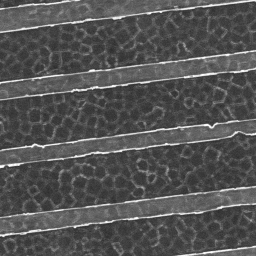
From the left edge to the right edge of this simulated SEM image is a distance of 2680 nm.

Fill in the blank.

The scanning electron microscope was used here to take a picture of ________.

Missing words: one or a few lines or trenches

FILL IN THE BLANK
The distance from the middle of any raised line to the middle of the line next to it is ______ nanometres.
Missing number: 697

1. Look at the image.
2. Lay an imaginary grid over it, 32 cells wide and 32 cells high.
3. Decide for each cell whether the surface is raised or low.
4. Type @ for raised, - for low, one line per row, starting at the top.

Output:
@@@@@@@---------------------@@@@
-------------------@@@@@@@@@@@@@
-----------@@@@@@@@@@@@@@@@@@@@@
----@@@@@@@@@@@@@@@@@@@@@@@@@@@@
@@@@@@@@@@@@@@@@@@@@@@@@@@@@@@@@
@@@@@@@@@@@@@@@@@@@@@@@@@@@@@@@@
@@@@@@@@@@@@@@@@@@@@@@@@@@@@@@@-
@@@@@@@@@@@@@@@@@@@@@@@---------
@@@@@@@@@@@@@@@-----------------
@@@@@@@-----------------@@@@@@@@
----------------@@@@@@@@@@@@@@@@
--------@@@@@@@@@@@@@@@@@@@@@@@@
@@@@@@@@@@@@@@@@@@@@@@@@@@@@@@@@
@@@@@@@@@@@@@@@@@@@@@@@@@@@@@@@@
@@@@@@@@@@@@@@@@@@@@@@@@@@@@@@@@
@@@@@@@@@@@@@@@@@@@@@@@@@@@-----
@@@@@@@@@@@@@@@@@@@-------------
@@@@@@@@@@@---------------@@@@@@
@@@---------------@@@@@@@@@@@@@@
----------@@@@@@@@@@@@@@@@@@@@@@
--@@@@@@@@@@@@@@@@@@@@@@@@@@@@@@
@@@@@@@@@@@@@@@@@@@@@@@@@@@@@@@@
@@@@@@@@@@@@@@@@@@@@@@@@@@@@@@@@
@@@@@@@@@@@@@@@@@@@@@@@@@@@@@@--
@@@@@@@@@@@@@@@@@@@@@@----------
@@@@@@@@@@@@@@------------------
@@@@@@-------------------@@@@@@@
--------------@@@@@@@@@@@@@@@@@@
-------@@@@@@@@@@@@@@@@@@@@@@@@@
@@@@@@@@@@@@@@@@@@@@@@@@@@@@@@@@
@@@@@@@@@@@@@@@@@@@@@@@@@@@@@@@@
@@@@@@@@@@@@@@@@@@@@@@@@@@@-----